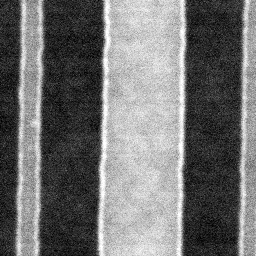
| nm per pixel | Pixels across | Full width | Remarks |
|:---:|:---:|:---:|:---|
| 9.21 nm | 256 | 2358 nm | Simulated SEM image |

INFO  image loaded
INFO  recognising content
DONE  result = lines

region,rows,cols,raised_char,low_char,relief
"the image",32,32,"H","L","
HHHLLHHHHHHHHLLLLLLLLLLHHHHHHHHL
HHHLLHHHHHHHHLLLLLLLLLLHHHHHHHHL
HHHLLHHHHHHHHLLLLLLLLLLHHHHHHHHL
HHHLLHHHHHHHHLLLLLLLLLLHHHHHHHHL
HHHLLHHHHHHHHLLLLLLLLLLHHHHHHHHL
HHHLLHHHHHHHHHLLLLLLLLLHHHHHHHHL
HHHLLHHHHHHHHLLLLLLLLLLHHHHHHHHL
HHHLLHHHHHHHHLLLLLLLLLLHHHHHHHHL
HHHLLHHHHHHHHLLLLLLLLLLHHHHHHHHL
HHHLLHHHHHHHHLLLLLLLLLLHHHHHHHHL
HHHLLHHHHHHHHLLLLLLLLLLHHHHHHHHL
HHHLLHHHHHHHHLLLLLLLLLLHHHHHHHHL
HHHLLHHHHHHHHLLLLLLLLLLHHHHHHHHL
HHHLLHHHHHHHHLLLLLLLLLLHHHHHHHHL
HHHLLHHHHHHHHLLLLLLLLLLHHHHHHHHL
HHHLLHHHHHHHHLLLLLLLLLLHHHHHHHHL
HHHLLHHHHHHHHLLLLLLLLLLHHHHHHHHL
HHHLLHHHHHHHHLLLLLLLLLLHHHHHHHHL
HHHLLHHHHHHHHLLLLLLLLLLHHHHHHHHL
HHHLLHHHHHHHHLLLLLLLLLLHHHHHHHLL
HHHLLHHHHHHHHLLLLLLLLLHHHHHHHHLL
HHHLLHHHHHHHHLLLLLLLLLHHHHHHHHLL
HHHLLHHHHHHHHLLLLLLLLLHHHHHHHHLL
HHHLLHHHHHHHHLLLLLLLLLHHHHHHHHLL
HHLLLHHHHHHHHLLLLLLLLLLHHHHHHHHL
HHLLLHHHHHHHHLLLLLLLLLHHHHHHHHHL
HHLLLHHHHHHHHLLLLLLLLLHHHHHHHHLL
HHLLHHHHHHHHHLLLLLLLLLHHHHHHHHLL
HHLLHHHHHHHHHLLLLLLLLLHHHHHHHHLL
HHLLHHHHHHHHHLLLLLLLLLHHHHHHHHLL
HHLLHHHHHHHHHLLLLLLLLLHHHHHHHHLL
HHLLHHHHHHHHHLLLLLLLLLHHHHHHHHLL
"